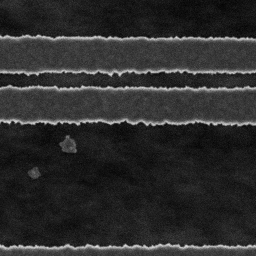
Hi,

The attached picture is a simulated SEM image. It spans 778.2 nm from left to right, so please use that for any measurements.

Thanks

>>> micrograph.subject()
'lines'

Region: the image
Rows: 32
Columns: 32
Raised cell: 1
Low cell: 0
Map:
00000000000000000000000000000000
00000000000000000000000000000000
00000000000000000000000000000000
00000000000000000000000000000000
00010000000000000000000000000000
11111111111111111111111111111111
11111111111111111111111111111111
11111111111111111111111111111111
11111111111111111111111111111111
00000000000000000000000000000000
00000000000000000000000000000000
11111111111111111111111111111111
11111111111111111111111111111111
11111111111111111111111111111111
11111111111111111111111111111111
00000010010000000011101000111111
00000000000000000000000000000000
00000000000000000000000000000000
00000000100000000000000000000000
00000000000000000000000000000000
00000000000000000000000000000000
00000000000000000000000000000000
00000000000000000000000000000000
00000000000000000000000000000000
00000000000000000000000000000000
00000000000000000000000000000000
00000000000000000000000000000000
00000000000000000000000000000000
00000000000000000000000000000000
00000000000000000000000000000000
00000000000000000000000000000000
11111111111111111111111111111111